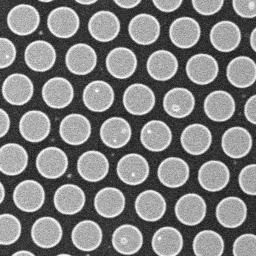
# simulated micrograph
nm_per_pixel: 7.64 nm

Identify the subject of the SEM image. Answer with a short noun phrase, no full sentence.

an array of small figures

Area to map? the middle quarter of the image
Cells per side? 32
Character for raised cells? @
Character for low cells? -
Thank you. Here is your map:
-@@@@@@@---@@@@@@@---@@@@@@@---@
-@@@@@@----@@@@@@@---@@@@@@@---@
---@@-------@@@@@----@@@@@@@---@
-------------@@-------@@@@-----@
@------@@@----------------------
@@----@@@@@------@@@------------
@@---@@@@@@@---@@@@@@@-----@@@--
@@---@@@@@@@---@@@@@@@----@@@@@@
@@---@@@@@@@---@@@@@@@@--@@@@@@@
@@---@@@@@@@---@@@@@@@@--@@@@@@@
------@@@@@@---@@@@@@@---@@@@@@@
-------@@@------@@@@@@---@@@@@@@
------------------@@------@@@@@-
@@@@@-------@@------------------
@@@@@@----@@@@@@-----@@@@-------
@@@@@@@---@@@@@@----@@@@@@-----@
@@@@@@@--@@@@@@@@--@@@@@@@----@@
@@@@@@---@@@@@@@@--@@@@@@@@---@@
@@@@@@---@@@@@@@---@@@@@@@@--@@@
-@@@@-----@@@@@@---@@@@@@@---@@@
-----------@@@@-----@@@@@@----@@
----------------------@@------@@
-----@@@@@-------@--------------
@---@@@@@@-----@@@@@------@@----
@---@@@@@@@---@@@@@@@---@@@@@@--
@--@@@@@@@@--@@@@@@@@---@@@@@@@-
---@@@@@@@@--@@@@@@@@---@@@@@@@-
----@@@@@@@---@@@@@@@---@@@@@@@-
-----@@@@@----@@@@@@----@@@@@@@-
---------------@@@@@----@@@@@@--
@@@-----------------------@@@---
@@@@-----@@@@@------------------